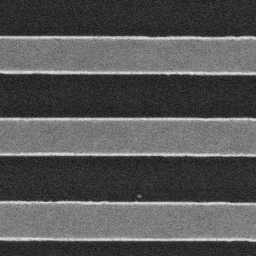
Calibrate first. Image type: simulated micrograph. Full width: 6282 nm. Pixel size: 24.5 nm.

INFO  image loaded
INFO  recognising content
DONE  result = lines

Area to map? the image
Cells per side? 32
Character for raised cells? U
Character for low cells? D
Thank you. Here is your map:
DDDDDDDDDDDDDDDDDDDDDDDDDDDDDDDD
DDDDDDDDDDDDDDDDDDDDDDDDDDDDDDDD
DDDDDDDDDDDDDDDDDDDDDDDDDDDDDDDD
DDDDDDDDDDDDDDDDDDDDDDDDDDDDDDDD
DDDDDDDDDDDDDDDDDDDDDDDDDDDDDDDD
UUUUUUUUUUUUUUUUUUUUUUUUUUUUUUUU
UUUUUUUUUUUUUUUUUUUUUUUUUUUUUUUU
UUUUUUUUUUUUUUUUUUUUUUUUUUUUUUUU
UUUUUUUUUUUUUUUUUUUUUUUUUUUUUUUU
DDDDDDDDDDDDDDDDDDDDDDDDDDDDDDDD
DDDDDDDDDDDDDDDDDDDDDDDDDDDDDDDD
DDDDDDDDDDDDDDDDDDDDDDDDDDDDDDDD
DDDDDDDDDDDDDDDDDDDDDDDDDDDDDDDD
DDDDDDDDDDDDDDDDDDDDDDDDDDDDDDDD
DDDDDDDDDDDDDDDDDDDDDDDDDDDDDDDD
UUUUUUUUUUUUUUUUUUUUUUUUUUUUUUUU
UUUUUUUUUUUUUUUUUUUUUUUUUUUUUUUU
UUUUUUUUUUUUUUUUUUUUUUUUUUUUUUUU
UUUUUUUUUUUUUUUUUUUUUUUUUUUUUUUU
DDDDDDDDDDDDDDDDDDDDDDDDDDDDDDDU
DDDDDDDDDDDDDDDDDDDDDDDDDDDDDDDD
DDDDDDDDDDDDDDDDDDDDDDDDDDDDDDDD
DDDDDDDDDDDDDDDDDDDDDDDDDDDDDDDD
DDDDDDDDDDDDDDDDDDDDDDDDDDDDDDDD
DDDDDDDDDDDDDDDDDDDDDDDDDDDDDDDD
UUUUUUUUUUUUUUUUUUUUUUUUUUUUUUUU
UUUUUUUUUUUUUUUUUUUUUUUUUUUUUUUU
UUUUUUUUUUUUUUUUUUUUUUUUUUUUUUUU
UUUUUUUUUUUUUUUUUUUUUUUUUUUUUUUU
UUUUUUUUUUUUUUUUUUUUUUUUUUUUUUUU
DDDDDDDDDDDDDDDDDDDDDDDDDDDDDDDD
DDDDDDDDDDDDDDDDDDDDDDDDDDDDDDDD